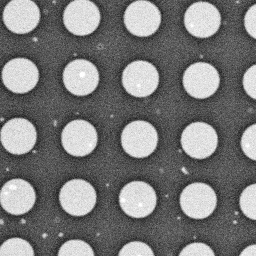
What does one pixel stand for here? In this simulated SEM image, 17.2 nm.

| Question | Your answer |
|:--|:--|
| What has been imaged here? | an array of small figures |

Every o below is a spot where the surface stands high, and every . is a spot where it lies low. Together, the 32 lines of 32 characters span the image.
.ooo.....ooo....ooo.....oo......
.oooo...oooo....oooo...oooo....o
ooooo...oooo....oooo...oooo....o
.ooo....oooo....oooo...oooo....o
........................oo......
................................
................................
..o.............................
ooooo...oooo....ooo.....ooo....o
ooooo...oooo...ooooo...oooo....o
.ooo....oooo...ooooo...oooo...oo
..o......oo.....ooo....oooo....o
................................
................................
................................
.ooo.....oo.....ooo.....oo......
oooo....oooo...oooo....oooo....o
oooo....oooo...ooooo...oooo...oo
.ooo....oooo...oooo....oooo...oo
.................o......oo.....o
................................
................................
.oo......o......................
oooo....oooo...oooo....ooo.....o
oooo...ooooo...oooo....oooo...oo
oooo....oooo...oooo....oooo...oo
.oo.....ooo.....ooo....oooo...oo
................................
................................
................................
oooo....ooo.....oo......o.......
oooo...ooooo...oooo....oooo...oo